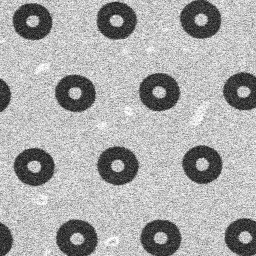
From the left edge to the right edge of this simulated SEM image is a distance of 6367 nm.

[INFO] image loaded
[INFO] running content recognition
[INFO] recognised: ring-shaped grooves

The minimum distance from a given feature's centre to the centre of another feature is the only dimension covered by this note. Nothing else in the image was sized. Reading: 2080 nm